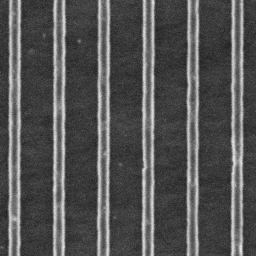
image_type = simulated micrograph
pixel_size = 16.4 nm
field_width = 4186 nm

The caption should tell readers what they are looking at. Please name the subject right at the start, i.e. parallel lines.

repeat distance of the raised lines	44.6	pixels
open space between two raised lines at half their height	576	nm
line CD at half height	151	nanometers